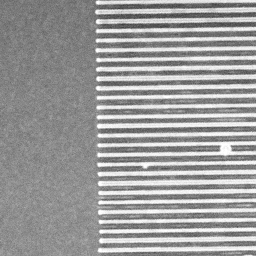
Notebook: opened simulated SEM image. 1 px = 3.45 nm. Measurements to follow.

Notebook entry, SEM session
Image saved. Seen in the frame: parallel lines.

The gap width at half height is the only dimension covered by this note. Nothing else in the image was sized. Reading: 0.0233 µm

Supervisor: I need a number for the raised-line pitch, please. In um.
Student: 0.0328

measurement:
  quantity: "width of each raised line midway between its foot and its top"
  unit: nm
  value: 9.9